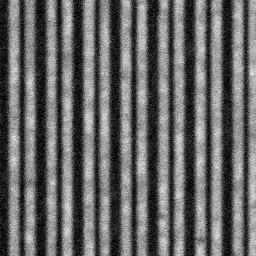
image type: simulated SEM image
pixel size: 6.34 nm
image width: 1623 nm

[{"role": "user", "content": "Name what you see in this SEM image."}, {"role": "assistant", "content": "parallel lines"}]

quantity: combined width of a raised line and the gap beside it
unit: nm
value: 118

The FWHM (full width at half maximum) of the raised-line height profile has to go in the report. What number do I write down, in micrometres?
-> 0.0539